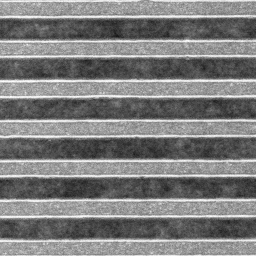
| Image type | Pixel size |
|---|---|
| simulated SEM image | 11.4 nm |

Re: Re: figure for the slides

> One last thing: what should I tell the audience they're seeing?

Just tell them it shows parallel lines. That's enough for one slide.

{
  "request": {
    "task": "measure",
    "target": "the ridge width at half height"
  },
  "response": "184 nm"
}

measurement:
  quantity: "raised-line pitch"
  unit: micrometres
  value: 0.454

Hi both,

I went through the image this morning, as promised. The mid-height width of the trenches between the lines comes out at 270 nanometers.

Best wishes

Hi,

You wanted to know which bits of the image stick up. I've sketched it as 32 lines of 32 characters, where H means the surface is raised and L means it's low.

HHHHHHHHHHHHHHHHHHHHHHHHHHHHHHHH
HHHHHHHHHHHHHHHHHHHHHHHHHHHHHHHH
LLLLLLLLLLLLLLLLLLLLLLLLLLLLLLLL
LLLLLLLLLLLLLLLLLLLLLLLLLLLLLLLL
LLLLLLLLLLLLLLLLLLLLLLLLLLLLLLLL
HHHHHHHHHHHHHHHHHHHHHHHHHHHHHHHH
HHHHHHHHHHHHHHHHHHHHHHHHHHHHHHHH
LLLLLLLLLLLLLLLLLLLLLLLLLLLLLLLL
LLLLLLLLLLLLLLLLLLLLLLLLLLLLLLLL
LLLLLLLLLLLLLLLLLLLLLLLLLLLLLLLL
HHHHHHHHHHHHHHHHHHHHHHHHHHHHHHHH
HHHHHHHHHHHHHHHHHHHHHHHHHHHHHHHH
LLLLLLLLLLLLLLLLLLLLLLLLLLLLLLLL
LLLLLLLLLLLLLLLLLLLLLLLLLLLLLLLL
LLLLLLLLLLLLLLLLLLLLLLLLLLLLLLLL
HHHHHHHHHHHHHHHHHHHHHHHHHHHHHHHH
HHHHHHHHHHHHHHHHHHHHHHHHHHHHHHHH
LLLLLLLLLLLLLLLLLLLLLLLLLLLLLLLL
LLLLLLLLLLLLLLLLLLLLLLLLLLLLLLLL
LLLLLLLLLLLLLLLLLLLLLLLLLLLLLLLL
HHHHHHHHHHHHHHHHHHHHHHHHHHHHHHHH
HHHHHHHHHHHHHHHHHHHHHHHHHHHHHHHH
LLLLLLLLLLLLLLLLLLLLLLLLLLLLLLLL
LLLLLLLLLLLLLLLLLLLLLLLLLLLLLLLL
LLLLLLLLLLLLLLLLLLLLLLLLLLLLLLLL
HHHHHHHHHHHHHHHHHHHHHHHHHHHHHHHH
HHHHHHHHHHHHHHHHHHHHHHHHHHHHHHHH
LLLLLLLLLLLLLLLLLLLLLLLLLLLLLLLL
LLLLLLLLLLLLLLLLLLLLLLLLLLLLLLLL
LLLLLLLLLLLLLLLLLLLLLLLLLLLLLLLL
HHHHHHHHHHHHHHHHHHHHHHHHHHHHHHHH
HHHHHHHHHHHHHHHHHHHHHHHHHHHHHHHH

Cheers